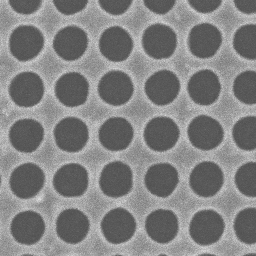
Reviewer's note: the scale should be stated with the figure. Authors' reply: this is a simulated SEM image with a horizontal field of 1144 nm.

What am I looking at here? a regular array of holes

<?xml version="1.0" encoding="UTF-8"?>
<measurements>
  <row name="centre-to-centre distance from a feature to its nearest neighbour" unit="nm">199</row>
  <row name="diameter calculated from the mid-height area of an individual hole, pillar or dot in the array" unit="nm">158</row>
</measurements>